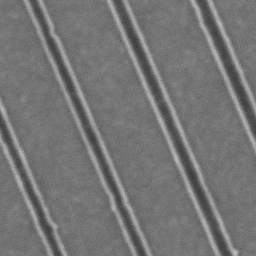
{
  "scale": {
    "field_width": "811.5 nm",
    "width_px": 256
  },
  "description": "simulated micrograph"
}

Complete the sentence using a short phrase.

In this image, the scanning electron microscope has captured one or a few lines or trenches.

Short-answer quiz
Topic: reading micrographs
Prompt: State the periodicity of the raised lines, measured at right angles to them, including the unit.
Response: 0.245 micrometres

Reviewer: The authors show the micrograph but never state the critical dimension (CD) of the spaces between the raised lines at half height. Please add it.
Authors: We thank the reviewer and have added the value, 196 nm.